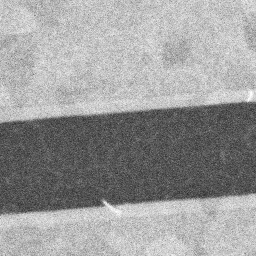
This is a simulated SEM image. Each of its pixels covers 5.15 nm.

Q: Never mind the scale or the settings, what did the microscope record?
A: one or a few lines or trenches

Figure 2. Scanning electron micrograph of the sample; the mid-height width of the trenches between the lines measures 0.547 µm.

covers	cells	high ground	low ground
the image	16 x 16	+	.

++++++++++++++++
++++++++++++++++
++++++++++++++++
++++++++++++++++
++++++++++++++++
++++++++++++++++
+++++++++.......
................
................
................
................
................
................
.....+++++++++++
++++++++++++++++
++++++++++++++++